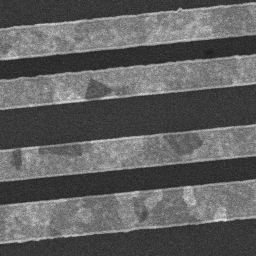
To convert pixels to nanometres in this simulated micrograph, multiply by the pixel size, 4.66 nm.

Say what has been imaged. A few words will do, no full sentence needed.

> one or a few lines or trenches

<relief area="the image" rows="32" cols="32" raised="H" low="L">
LLLLLLLLLLLLLLLLLLLLLLLLLLLLLLLH
LLLLLLLLLLLLLLLLLLLLLHHHHHHHHHHH
LLLLLLLLLLLLHHHHHHHHHHHHHHHHHHHH
LHHHHHHHHHHHHHHHHHHHHHHHHHHHHHHH
HHHHHHHHHHHHHHHHHHHHHHHHHHHHHLLL
HHHHHHHHHHHHHHHHHHHLLLLLLLLLLLLL
HHHHHHHHHLLLLLLLLLLLLLLLLLLLLLLL
LLLLLLLLLLLLLLLLLLLLLLLLLLHHHHHH
LLLLLLLLLLLLLLLHHHHHHHHHHHHHHHHH
LLLLLHHHHHHHHHHHHHHHHHHHHHHHHHHH
HHHHHHHHHHHHHHHHHHHHHHHHHHHHHHHL
HHHHHHHHHHHHHHHHHHHHHLLLLLLLLLLL
HHHHHHHHHHHLLLLLLLLLLLLLLLLLLLLL
HLLLLLLLLLLLLLLLLLLLLLLLLLLLLLLL
LLLLLLLLLLLLLLLLLLLLLLLLLLLLLLLL
LLLLLLLLLLLLLLLLLLLLLLLLLLLLLLLL
LLLLLLLLLLLLLLLLLLLLLLLLHHHHHHHH
LLLLLLLLLLLLLLHHHHHHHHHHHHHHHHHH
LLLLHHHHHHHHHHHHHHHHHHHHHHHHHHHH
HHHHHHHHHHHHHHHHHHHHHHHHHHHHHHHL
HHHHHHHHHHHHHHHHHHHHHLLLLLLLLLLL
HHHHHHHHHHHLLLLLLLLLLLLLLLLLLLLL
HLLLLLLLLLLLLLLLLLLLLLLLLLLLLLLL
LLLLLLLLLLLLLLLLLLLLLLHHHHHHHHHH
LLLLLLLLLLLLHHHHHHHHHHHHHHHHHHHH
LLHHHHHHHHHHHHHHHHHHHHHHHHHHHHHH
HHHHHHHHHHHHHHHHHHHHHHHHHHHHHHHH
HHHHHHHHHHHHHHHHHHHHHHHHHHHHHLLL
HHHHHHHHHHHHHHHHHHLLLLLLLLLLLLLL
HHHHHHHHHLLLLLLLLLLLLLLLLLLLLLLL
LLLLLLLLLLLLLLLLLLLLLLLLLLLLLLLL
LLLLLLLLLLLLLLLLLLLLLLLLLLLLLLLL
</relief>